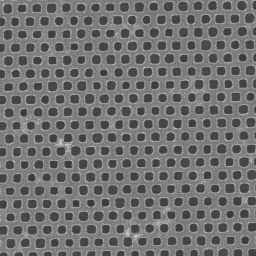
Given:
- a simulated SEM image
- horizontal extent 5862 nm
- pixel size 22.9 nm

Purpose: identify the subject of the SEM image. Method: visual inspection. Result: a regular array of holes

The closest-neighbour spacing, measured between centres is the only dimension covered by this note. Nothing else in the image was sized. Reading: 0.33 µm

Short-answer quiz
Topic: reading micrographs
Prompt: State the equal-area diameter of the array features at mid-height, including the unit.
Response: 215 nanometers